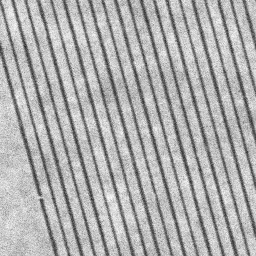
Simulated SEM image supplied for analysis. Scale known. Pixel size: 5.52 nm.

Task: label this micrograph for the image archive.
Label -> parallel lines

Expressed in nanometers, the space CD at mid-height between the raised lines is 20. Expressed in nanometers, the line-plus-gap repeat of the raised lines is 68.3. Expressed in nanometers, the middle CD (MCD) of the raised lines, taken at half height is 48.6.